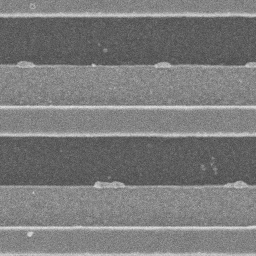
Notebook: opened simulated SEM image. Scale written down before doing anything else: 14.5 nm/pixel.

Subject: lines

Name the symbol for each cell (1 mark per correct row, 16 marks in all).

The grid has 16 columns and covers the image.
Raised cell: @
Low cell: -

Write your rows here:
@@@@@@@@@@@@@@@@
----------------
----------------
----------------
@@@@@@@@@@@@@@@@
@@@@@@@@@@@@@@@@
@@@@@@@@@@@@@@@@
@@@@@@@@@@@@@@@@
----------------
----------------
----------------
------@@------@-
@@@@@@@@@@@@@@@@
@@@@@@@@@@@@@@@@
@@@@@@@@@@@@@@@@
@@@@@@@@@@@@@@@@